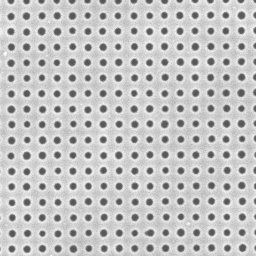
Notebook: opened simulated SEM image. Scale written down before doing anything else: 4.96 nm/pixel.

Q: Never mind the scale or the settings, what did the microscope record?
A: a regular array of holes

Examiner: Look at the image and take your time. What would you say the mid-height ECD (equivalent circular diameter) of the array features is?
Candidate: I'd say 36.7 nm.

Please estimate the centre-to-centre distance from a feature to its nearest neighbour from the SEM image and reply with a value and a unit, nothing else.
73.7 nm